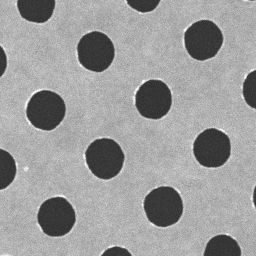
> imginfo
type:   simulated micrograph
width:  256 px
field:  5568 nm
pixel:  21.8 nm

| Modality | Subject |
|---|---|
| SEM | a regular array of holes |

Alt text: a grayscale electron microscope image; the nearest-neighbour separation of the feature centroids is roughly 1650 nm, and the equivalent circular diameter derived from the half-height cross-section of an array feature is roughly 868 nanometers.